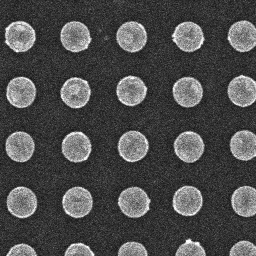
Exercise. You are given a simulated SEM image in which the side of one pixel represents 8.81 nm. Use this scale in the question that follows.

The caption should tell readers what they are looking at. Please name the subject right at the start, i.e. a regular array of raised bodies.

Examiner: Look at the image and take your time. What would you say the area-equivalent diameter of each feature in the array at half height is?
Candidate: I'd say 0.264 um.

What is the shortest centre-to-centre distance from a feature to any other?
481 nanometers